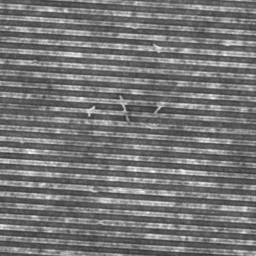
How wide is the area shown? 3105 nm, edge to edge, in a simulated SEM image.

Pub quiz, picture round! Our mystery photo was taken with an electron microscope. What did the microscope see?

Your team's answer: parallel lines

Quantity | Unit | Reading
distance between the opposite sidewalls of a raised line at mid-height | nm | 53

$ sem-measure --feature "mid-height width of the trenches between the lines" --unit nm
83.2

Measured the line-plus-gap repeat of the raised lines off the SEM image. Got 11 px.